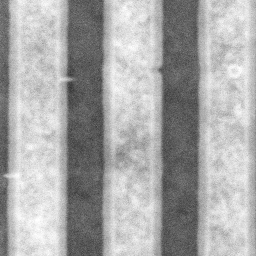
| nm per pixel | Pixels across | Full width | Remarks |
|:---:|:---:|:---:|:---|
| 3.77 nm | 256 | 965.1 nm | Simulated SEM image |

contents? one or a few lines or trenches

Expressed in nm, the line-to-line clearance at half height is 181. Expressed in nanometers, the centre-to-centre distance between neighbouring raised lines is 357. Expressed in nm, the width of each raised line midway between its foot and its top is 177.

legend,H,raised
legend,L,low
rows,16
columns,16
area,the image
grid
LHHHLLLHHHLLLHHH
LHHHLLLHHHLLLHHH
LHHHLLLHHHLLLHHH
LHHHLLLHHHLLLHHH
LHHHLLLHHHLLLHHH
LHHHLLLHHHLLLHHH
LHHHLLLHHHLLLHHH
LHHHLLLHHHLLLHHH
LHHHLLLHHHLLLHHH
LHHHLLLHHHLLLHHH
LHHHLLLHHHLLLHHH
LHHHLLLHHHLLLHHH
LHHHLLLHHHLLLHHH
LHHHLLLHHHLLLHHH
LHHHLLLHHHLLLHHH
LHHHLLLHHHLLLHHH